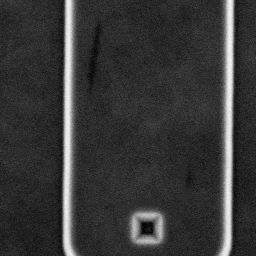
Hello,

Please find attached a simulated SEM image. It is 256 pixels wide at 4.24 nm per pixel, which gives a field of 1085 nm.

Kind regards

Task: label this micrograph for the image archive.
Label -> wiring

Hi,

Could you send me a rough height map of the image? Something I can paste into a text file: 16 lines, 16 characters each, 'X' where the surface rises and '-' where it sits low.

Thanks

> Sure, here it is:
----XXXXXXXXXX--
----XXXXXXXXXX--
----XXXXXXXXXX--
----XXXXXXXXXX--
----XXXXXXXXXX--
----XXXXXXXXXX--
----XXXXXXXXXX--
----XXXXXXXXXX--
----XXXXXXXXXX--
----XXXXXXXXXX--
----XXXXXXXXXX--
----XXXXXXXXXX--
----XXXXXXXXXX--
----XXXXXXXXXX--
----XXXXX-XXXX--
----XXXXXXXXXX--